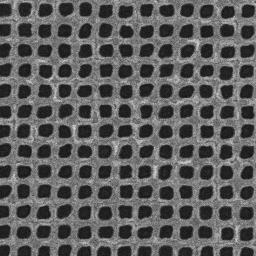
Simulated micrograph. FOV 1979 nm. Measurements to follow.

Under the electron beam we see a regular array of holes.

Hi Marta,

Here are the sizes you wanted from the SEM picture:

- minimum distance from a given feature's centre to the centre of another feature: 150 nanometers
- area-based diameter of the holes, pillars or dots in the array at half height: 13.9 pixels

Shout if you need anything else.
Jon